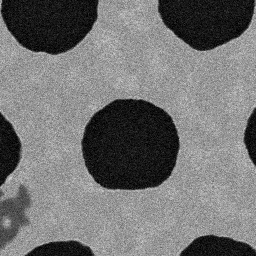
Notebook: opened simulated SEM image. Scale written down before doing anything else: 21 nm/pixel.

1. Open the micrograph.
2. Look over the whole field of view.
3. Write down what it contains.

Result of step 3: holes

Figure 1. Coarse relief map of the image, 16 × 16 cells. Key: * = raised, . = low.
......****......
......****......
*....******...**
****************
****************
****************
*******...******
******.....*****
.****......****.
.****......*****
.****......*****
******....******
****************
****************
****************
**....******....